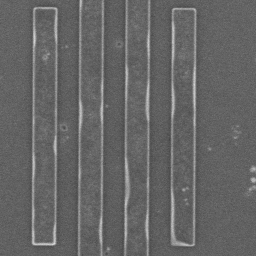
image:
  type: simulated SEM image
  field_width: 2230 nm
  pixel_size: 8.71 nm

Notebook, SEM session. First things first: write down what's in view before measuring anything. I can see groups of lines, slits or small figures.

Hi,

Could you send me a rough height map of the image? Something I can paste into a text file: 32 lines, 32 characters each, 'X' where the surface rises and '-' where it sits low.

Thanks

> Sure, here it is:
----------XXX---XXX-------------
----XXX---XXX---XXX---XX--------
----XXX---XXX---XXX---XX--------
----XXX---XXX---XXX---XX--------
----XXX---XXX---XXX---XX--------
----XXX---XXX---XXX---XX--------
----XXX---XXX---XXX---XX--------
----XXX---XXX---XXX---XX--------
----XXX---XXX---XXX---XX--------
----XXX---XXX---XXX---XX--------
----XXX---XXX---XXX---XX--------
----XXX---XXX---XX----XX--------
----XXX---XXX---XX----XX--------
----XXX---XXX---XX----XX--------
----XXX---XXX---XX---XXX--------
----XXX---XXX---XXX--XXX--------
----XXX---XXX---XXX--XXX--------
----XXX---XXX---XXX--XXX--------
----XXX---XXX---XXX--XXX--------
----XXX---XXX---XXX--XXX--------
----XXX---XXX---XXX--XXX--------
----XXX---XXX---XX---XXX--------
----XXX---XXX---XX---XXX--------
----XXX---XXX---XX---XXX--------
----XXX---XXX---XX---XXX--------
----XXX---XXX---XX----XX--------
----XXX---XXX---XX----XX--------
----XXX---XXX---XX----XX--------
----XXX---XXX---XX----XX--------
----XXX---XXX---XX----XX--------
----XX----XXX---XX----XX--------
----------XXX---XX--------------